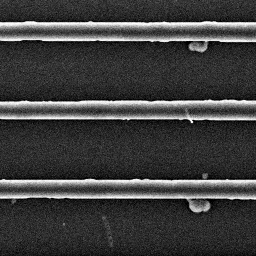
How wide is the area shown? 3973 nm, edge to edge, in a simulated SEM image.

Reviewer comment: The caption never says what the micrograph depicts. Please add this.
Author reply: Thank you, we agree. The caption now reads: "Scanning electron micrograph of lines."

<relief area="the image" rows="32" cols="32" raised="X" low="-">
--------------------------------
--------------------------------
--------------------------------
XXXXXXXXXXXXXXXXXXXXXXXXXXXXXXXX
XXXXXXXXXXXXXXXXXXXXXXXXXXXXXXXX
--------------------------------
--------------------------------
--------------------------------
--------------------------------
--------------------------------
--------------------------------
--------------------------------
--------------------------------
XXXXXXXXXXXXXXXXXXXXXXXXXXXXXXXX
XXXXXXXXXXXXXXXXXXXXXXXXXXXXXXXX
--------------------------------
--------------------------------
--------------------------------
--------------------------------
--------------------------------
--------------------------------
--------------------------------
----------------X---------------
XXXXXXXXXXXXXXXXXXXXXXXXXXXXXXXX
XXXXXXXXXXXXXXXXXXXXXXXXXXXXXXXX
--------------------------------
--------------------------------
--------------------------------
--------------------------------
--------------------------------
--------------------------------
--------------------------------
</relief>